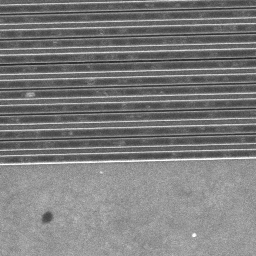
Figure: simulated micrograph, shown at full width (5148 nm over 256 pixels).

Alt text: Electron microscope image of parallel lines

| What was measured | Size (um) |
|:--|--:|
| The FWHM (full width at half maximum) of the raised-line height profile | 0.189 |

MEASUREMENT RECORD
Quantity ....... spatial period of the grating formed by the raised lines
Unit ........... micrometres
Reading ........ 0.254